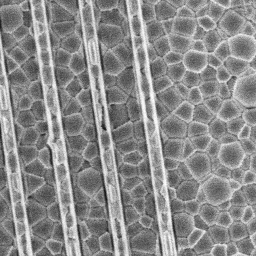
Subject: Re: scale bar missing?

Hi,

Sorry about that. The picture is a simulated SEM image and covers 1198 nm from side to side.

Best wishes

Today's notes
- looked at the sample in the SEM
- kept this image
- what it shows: parallel lines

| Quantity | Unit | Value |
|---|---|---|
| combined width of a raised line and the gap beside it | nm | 224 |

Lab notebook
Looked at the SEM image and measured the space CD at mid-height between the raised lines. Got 164 nanometres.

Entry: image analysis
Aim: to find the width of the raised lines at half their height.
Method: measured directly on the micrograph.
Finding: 0.0562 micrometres